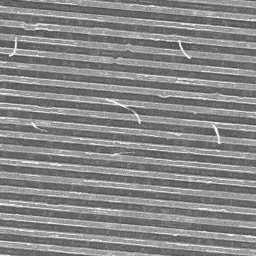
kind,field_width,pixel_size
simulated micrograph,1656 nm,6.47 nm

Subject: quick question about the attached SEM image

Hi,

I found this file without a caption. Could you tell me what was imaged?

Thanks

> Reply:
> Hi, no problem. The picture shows parallel lines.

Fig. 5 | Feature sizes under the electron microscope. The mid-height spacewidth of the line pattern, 48.3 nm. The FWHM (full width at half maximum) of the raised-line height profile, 37.8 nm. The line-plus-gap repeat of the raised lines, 89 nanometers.